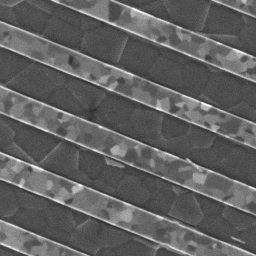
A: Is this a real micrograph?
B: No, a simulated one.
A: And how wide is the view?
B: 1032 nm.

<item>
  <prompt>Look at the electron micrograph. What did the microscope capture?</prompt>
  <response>one or a few lines or trenches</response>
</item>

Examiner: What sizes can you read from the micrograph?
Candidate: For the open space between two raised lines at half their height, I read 154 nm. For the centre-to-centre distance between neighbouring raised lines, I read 61.3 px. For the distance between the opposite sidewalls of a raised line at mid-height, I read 0.0964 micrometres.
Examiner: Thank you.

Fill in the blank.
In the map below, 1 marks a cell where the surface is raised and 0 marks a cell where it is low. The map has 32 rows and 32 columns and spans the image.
00000000111111100000000000001111
00000000001111111100000000000011
00000000000001111111000000000000
11000000000000011111111000000000
11111000000000000011111110000000
11111110000000000000111111110000
00111111110000000000000111111100
00001111111100000000000001111111
00000001111111100000000000011111
00000000011111111000000000000011
00000000000011111111000000000000
11000000000000111111110000000000
11110000000000000111111110000000
11111110000000000001111111100000
01111111100000000000001111111000
00001111111100000000000011111111
00000011111111000000000000011111
00000000011111111000000000000111
00000000000111111110000000000000
10000000000000111111110000000000
11110000000000001111111100000000
11111100000000000001111111100000
11111111100000000000011111111000
00011111111000000000000011111111
00000111111111000000000000111111
00000000111111110000000000000111
00000000001111111100000000000001
00000000000001111111100000000000
11100000000000011111111000000000
11111000000000000011111111000000
11111111000000000000111111110000
00011111110000000000000111111110